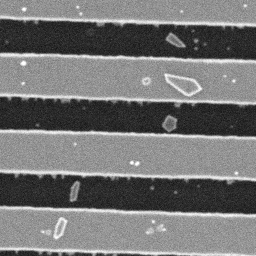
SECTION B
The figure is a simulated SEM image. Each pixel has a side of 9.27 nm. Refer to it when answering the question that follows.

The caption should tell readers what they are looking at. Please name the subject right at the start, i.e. lines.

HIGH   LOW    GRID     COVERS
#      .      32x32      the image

################################
################################
.....###########################
................................
................................
................................
................................
##############################..
################################
################################
################################
################################
...............#################
................................
................................
................................
#########.......................
################################
################################
################################
################################
################################
...............................#
................................
................................
................................
#####################...........
################################
################################
################################
################################
..........######################